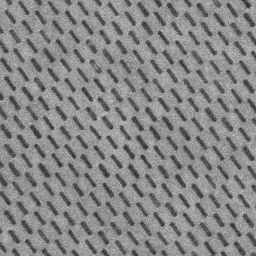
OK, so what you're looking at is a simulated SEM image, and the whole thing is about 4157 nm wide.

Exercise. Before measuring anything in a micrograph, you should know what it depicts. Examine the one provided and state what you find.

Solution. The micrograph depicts a regular array of holes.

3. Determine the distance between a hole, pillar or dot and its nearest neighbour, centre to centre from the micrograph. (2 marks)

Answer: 255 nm